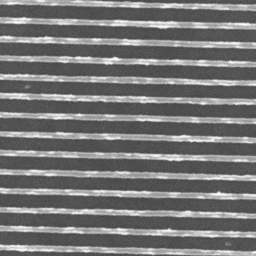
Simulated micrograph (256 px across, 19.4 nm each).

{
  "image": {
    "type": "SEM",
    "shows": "parallel lines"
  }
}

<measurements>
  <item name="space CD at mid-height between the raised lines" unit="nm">279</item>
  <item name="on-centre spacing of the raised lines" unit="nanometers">367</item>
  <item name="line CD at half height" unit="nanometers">87.3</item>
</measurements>